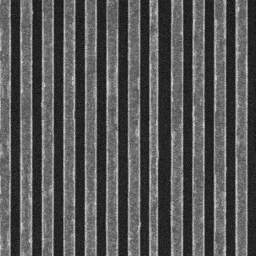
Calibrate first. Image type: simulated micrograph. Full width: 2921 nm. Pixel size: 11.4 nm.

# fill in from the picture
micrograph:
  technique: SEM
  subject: parallel lines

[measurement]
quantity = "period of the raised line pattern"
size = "245 nm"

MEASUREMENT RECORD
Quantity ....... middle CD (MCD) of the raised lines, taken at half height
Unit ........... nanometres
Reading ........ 127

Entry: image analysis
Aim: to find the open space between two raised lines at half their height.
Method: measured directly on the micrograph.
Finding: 10.4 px